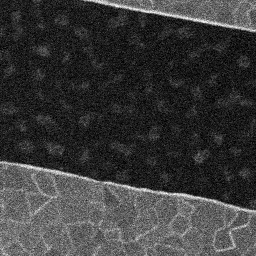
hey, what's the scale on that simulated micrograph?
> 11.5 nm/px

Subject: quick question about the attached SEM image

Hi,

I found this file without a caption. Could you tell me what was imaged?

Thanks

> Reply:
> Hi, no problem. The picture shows one or a few lines or trenches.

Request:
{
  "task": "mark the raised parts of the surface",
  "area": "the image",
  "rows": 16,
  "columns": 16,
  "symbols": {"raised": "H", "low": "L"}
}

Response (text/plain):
LLLLLLLLHHHHHHHH
LLLLLLLLLLLLLLHH
LLLLLLLLLLLLLLLL
LLLLLLLLLLLLLLLL
LLLLLLLLLLLLLLLL
LLLLLLLLLLLLLLLL
LLLLLLLLLLLLLLLL
LLLLLLLLLLLLLLLL
LLLLLLLLLLLLLLLL
LLLLLLLLLLLLLLLL
HHLLLLLLLLLLLLLL
HHHHHHHLLLLLLLLL
HHHHHHHHHHHHHLLL
HHHHHHHHHHHHHHHH
HHHHHHHHHHHHHHHH
HHHHHHHHHHHHHHHH